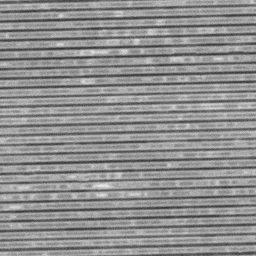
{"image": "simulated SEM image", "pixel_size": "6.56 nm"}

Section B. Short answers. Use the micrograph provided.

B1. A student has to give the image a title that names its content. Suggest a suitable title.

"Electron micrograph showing parallel lines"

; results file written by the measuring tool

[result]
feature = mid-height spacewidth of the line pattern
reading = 24.6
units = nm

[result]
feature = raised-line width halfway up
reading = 37.7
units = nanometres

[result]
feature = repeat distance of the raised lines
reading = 62.4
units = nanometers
